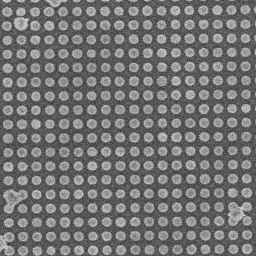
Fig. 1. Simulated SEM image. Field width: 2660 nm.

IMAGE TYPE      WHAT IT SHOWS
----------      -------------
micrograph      a regular array of raised bodies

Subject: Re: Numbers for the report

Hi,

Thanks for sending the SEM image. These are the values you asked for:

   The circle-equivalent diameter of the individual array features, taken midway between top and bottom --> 96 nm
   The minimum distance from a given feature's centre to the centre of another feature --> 143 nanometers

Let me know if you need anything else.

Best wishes